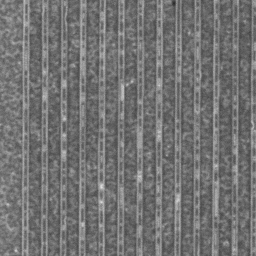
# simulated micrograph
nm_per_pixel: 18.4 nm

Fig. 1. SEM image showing parallel lines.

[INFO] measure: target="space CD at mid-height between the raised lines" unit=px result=14.1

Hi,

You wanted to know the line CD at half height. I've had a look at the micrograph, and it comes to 0.0874 micrometres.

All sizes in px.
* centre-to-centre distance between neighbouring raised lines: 19